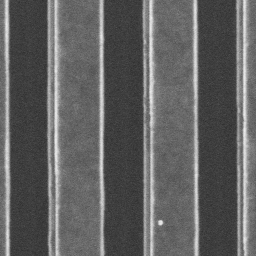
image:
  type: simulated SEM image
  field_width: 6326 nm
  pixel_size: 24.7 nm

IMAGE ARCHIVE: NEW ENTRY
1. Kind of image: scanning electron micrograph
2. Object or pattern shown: lines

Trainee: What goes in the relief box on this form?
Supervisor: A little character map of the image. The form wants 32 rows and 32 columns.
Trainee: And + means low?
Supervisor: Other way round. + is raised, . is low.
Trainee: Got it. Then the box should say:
+.....+++++++.....++++++......++
+.....+++++++.....++++++......++
+.....+++++++.....++++++......++
+.....+++++++.....++++++......++
+.....+++++++.....++++++......++
+.....+++++++.....++++++......++
+.....+++++++.....++++++......++
+.....+++++++.....++++++......++
+.....+++++++.....++++++......++
+.....+++++++.....++++++......++
+.....+++++++.....++++++......++
+.....+++++++.....++++++......++
+.....+++++++.....++++++......++
+.....+++++++.....++++++......++
+.....+++++++.....++++++......++
+.....+++++++.....++++++......++
+.....+++++++.....++++++......++
+.....+++++++.....++++++......++
+.....+++++++.....++++++......++
+.....+++++++.....+++++++.....++
+.....+++++++.....+++++++.....++
+.....+++++++.....+++++++.....++
+.....+++++++.....+++++++.....++
+.....+++++++.....+++++++.....++
+.....+++++++.....+++++++.....++
+.....+++++++.....+++++++.....++
+.....+++++++.....+++++++.....++
+.....+++++++.....+++++++.....++
+.....+++++++.....+++++++.....++
+.....+++++++.....+++++++.....++
+.....+++++++.....+++++++.....++
+.....+++++++.....+++++++.....++